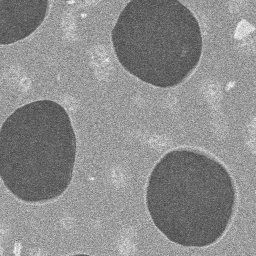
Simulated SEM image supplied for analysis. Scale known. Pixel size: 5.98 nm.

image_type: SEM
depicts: holes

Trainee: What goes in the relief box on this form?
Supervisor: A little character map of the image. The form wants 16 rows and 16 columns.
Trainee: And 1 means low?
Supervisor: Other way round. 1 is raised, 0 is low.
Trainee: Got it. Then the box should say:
0001111100001111
0001111000001111
0111111000000111
1111111000000111
1111111100001111
1111111111111111
1100111111111111
0000111111111111
0000011111111111
0000011111100111
0000011111000011
0000111110000001
1001111110000001
1111111110000001
1111111111000011
1111111111111111